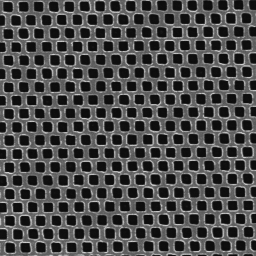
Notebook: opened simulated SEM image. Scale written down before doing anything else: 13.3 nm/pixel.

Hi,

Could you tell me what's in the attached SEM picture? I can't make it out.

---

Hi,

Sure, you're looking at a regular array of holes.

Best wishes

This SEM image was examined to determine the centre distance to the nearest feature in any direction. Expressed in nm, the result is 199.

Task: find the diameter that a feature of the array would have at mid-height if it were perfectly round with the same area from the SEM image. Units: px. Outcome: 10.9